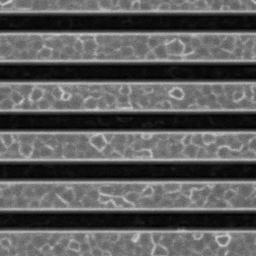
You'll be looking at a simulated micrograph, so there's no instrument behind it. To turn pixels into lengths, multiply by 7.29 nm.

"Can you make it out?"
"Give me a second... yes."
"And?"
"parallel lines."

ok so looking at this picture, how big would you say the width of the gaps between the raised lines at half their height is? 17.9 pixels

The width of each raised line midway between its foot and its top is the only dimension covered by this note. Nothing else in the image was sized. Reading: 229 nm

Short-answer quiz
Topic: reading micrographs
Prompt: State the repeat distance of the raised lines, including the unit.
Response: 49.5 pixels